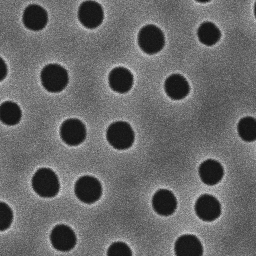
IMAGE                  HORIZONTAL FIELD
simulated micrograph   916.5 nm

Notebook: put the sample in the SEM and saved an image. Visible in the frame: a regular array of holes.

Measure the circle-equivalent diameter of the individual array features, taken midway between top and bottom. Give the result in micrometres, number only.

0.0942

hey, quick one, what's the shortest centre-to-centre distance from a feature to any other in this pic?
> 49.1 pixels